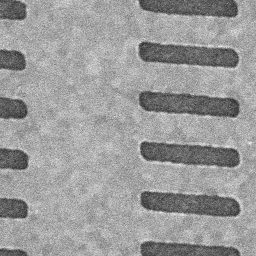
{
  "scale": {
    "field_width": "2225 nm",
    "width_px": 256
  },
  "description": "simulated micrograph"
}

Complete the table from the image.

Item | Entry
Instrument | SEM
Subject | holes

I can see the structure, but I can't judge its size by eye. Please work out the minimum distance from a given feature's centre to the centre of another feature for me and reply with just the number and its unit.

430 nanometers